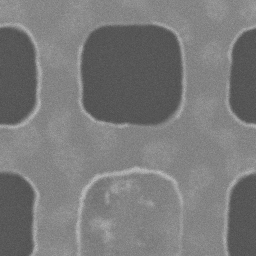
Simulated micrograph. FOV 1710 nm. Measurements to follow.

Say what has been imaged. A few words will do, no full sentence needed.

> holes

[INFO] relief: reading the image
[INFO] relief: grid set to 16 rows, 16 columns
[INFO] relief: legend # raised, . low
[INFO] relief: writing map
################
########.#######
..###......####.
..###......###..
..###......###..
..###......###..
..###......###..
.#####.....####.
################
################
################
..#############.
..############..
..############..
..############..
..############..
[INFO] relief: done